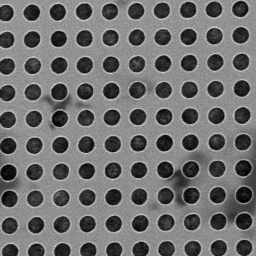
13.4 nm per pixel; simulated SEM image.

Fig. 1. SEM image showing a regular array of holes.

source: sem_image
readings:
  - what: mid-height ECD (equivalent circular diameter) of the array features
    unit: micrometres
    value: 0.223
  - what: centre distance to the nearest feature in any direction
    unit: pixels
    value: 25.9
